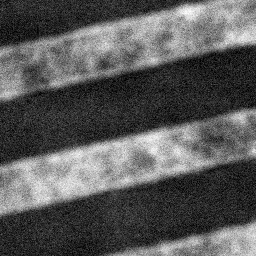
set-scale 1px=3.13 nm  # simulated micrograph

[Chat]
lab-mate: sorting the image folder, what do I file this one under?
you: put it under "one or a few lines or trenches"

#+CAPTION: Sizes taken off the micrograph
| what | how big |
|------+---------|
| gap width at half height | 212 nm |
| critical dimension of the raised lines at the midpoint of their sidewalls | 0.139 micrometres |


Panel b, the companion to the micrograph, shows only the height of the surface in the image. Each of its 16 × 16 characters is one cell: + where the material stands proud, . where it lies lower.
............++++
.......+++++++++
...+++++++++++++
++++++++++++....
+++++++.........
+++.............
................
.............+++
.........+++++++
....++++++++++++
++++++++++++....
++++++++........
++++............
................
..............++
..........++++++